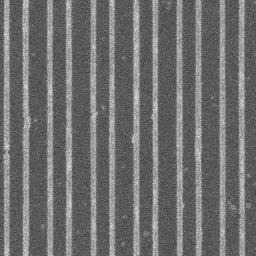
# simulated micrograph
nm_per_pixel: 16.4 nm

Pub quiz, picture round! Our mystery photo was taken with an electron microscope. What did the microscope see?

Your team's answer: parallel lines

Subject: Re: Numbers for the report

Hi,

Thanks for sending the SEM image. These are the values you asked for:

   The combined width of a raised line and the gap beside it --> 352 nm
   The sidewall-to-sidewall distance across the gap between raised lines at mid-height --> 242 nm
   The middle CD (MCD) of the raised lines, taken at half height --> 76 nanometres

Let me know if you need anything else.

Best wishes